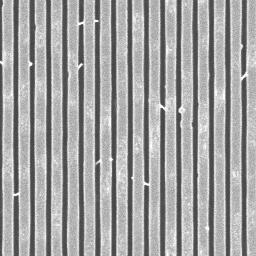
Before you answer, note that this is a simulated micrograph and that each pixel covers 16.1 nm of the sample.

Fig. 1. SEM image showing parallel lines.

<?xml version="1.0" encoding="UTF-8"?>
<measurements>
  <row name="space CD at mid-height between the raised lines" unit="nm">74.6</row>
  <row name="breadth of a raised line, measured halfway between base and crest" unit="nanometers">192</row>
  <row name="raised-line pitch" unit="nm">263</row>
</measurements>